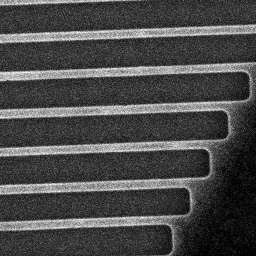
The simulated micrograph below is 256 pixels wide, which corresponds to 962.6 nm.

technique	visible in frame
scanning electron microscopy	parallel lines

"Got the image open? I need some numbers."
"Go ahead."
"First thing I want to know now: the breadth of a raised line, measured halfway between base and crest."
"29.6 nm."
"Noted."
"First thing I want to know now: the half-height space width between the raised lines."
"111 nanometres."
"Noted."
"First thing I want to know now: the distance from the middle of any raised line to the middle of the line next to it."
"142 nanometers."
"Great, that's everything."